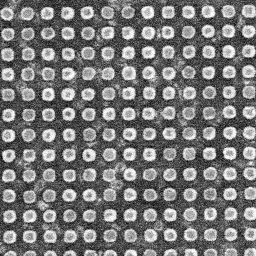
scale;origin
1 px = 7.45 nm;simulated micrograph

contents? a regular array of raised bodies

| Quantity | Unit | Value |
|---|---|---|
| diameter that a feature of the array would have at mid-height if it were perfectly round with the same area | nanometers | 91.3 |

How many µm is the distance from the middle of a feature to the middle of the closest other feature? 0.147